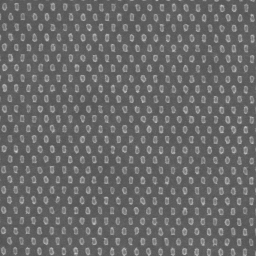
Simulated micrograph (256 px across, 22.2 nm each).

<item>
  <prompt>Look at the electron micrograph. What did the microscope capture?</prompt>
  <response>a regular array of raised bodies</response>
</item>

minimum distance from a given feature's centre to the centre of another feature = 252 nm